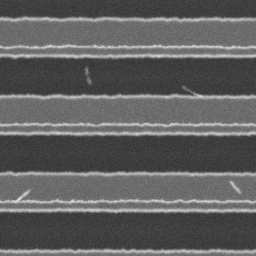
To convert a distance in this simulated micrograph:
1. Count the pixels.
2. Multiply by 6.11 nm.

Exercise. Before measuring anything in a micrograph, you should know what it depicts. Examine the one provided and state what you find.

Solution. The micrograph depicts lines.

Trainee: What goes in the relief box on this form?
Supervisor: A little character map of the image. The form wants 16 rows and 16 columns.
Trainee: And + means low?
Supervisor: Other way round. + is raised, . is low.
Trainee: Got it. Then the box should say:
................
++++++++++++++++
++++++++++++++++
++++++++++++++++
................
................
++++++++++++++++
++++++++++++++++
................
................
................
++++++++++++++++
++++++++++++++++
................
................
................